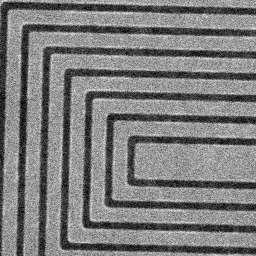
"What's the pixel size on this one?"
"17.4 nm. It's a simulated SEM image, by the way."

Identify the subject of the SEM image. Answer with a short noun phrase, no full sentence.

groups of lines, slits or small figures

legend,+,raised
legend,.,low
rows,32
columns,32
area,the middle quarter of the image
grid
++++++++++++++++++++++++++++++++
.......................+++++++++
................................
..++++++++......................
..++++++++++++++++++++++++++++++
..++++++++++++++++++++++++++++++
..+++++.....++++++++++++++++++++
..+++...........................
..+++...........................
..+++..+++++++++++++++++++++++++
..+++..+++++++++++++++++++++++++
..+++..+++++++++++++++++++++++++
..+++..++++....................+
..+++..+++......................
..+++..+++...+++................
..+++..+++...+++++++++++++++++++
..+++..+++...+++++++++++++++++++
..+++..+++...+++++++++++++++++++
..+++..+++...+++................
..+++..+++...+++................
..+++..+++...+++..++++++++++++++
..+++..+++...+++..++++++++++++++
..+++..+++...+++..++++++++++++++
..+++..+++...+++..++++++++++++++
..+++..+++...+++..++++++++++++++
..+++..+++..++++..++++++++++++++
..+++..+++..++++..++++++++++++++
..+++..+++..++++..++++++++++++++
..+++..+++..++++..++++++++++++++
.++++..+++..++++................
.++++..+++..++++................
.++++..+++..++++++++++++++++++++